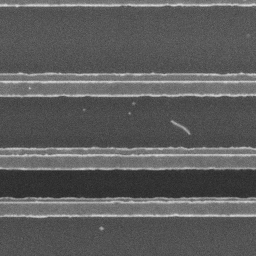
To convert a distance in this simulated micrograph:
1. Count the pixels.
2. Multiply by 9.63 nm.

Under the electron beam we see lines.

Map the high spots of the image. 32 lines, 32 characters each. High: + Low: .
++++++++++++++++++++++++++++++++
................................
................................
................................
................................
................................
................................
................................
................................
++++++++++++++++++++++++++++++++
++++++++++++++++++++++++++++++++
++++++++++++++++++++++++++++++++
................................
................................
................................
................................
................................
................................
......................+.......+.
++++++++++++++++++++++++++++++++
++++++++++++++++++++++++++++++++
................................
................................
................................
................................
++++++++++++++++++++++++++++++++
++++++++++++++++++++++++++++++++
................................
................................
................................
................................
................................